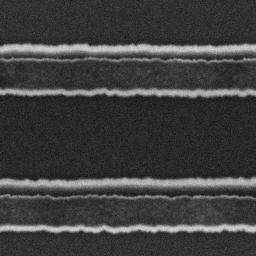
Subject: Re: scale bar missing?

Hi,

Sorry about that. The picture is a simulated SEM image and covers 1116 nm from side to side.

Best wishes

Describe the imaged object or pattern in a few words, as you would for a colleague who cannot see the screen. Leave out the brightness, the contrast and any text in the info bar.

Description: lines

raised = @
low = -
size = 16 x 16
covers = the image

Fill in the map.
----------------
----------------
----------------
----------------
@@@@@@@@@@@@@@@@
@@@@@@@@@@@@@@@@
----------------
----------------
----------------
----------------
----------------
----------------
@@@@@@@@@@@@@@@@
@@@@@@@@@@@@@@@@
----------------
----------------